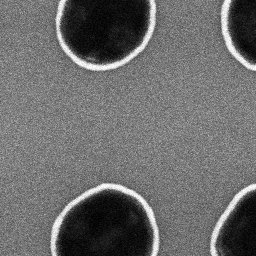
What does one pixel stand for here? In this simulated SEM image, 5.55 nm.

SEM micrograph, raised bodies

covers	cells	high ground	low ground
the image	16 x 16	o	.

....oooooo....oo
....oooooo....oo
....ooooo.....oo
....oooo.......o
................
................
................
................
................
................
................
................
.....oooo......o
....oooooo....oo
...ooooooo...ooo
...ooooooo...ooo